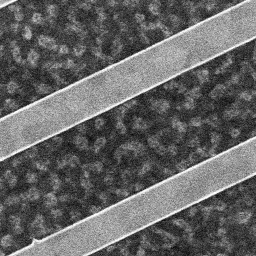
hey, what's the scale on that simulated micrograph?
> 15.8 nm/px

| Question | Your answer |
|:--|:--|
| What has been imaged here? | one or a few lines or trenches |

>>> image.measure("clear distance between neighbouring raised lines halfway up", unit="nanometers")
1440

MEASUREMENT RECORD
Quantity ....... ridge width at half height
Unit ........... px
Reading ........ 36.4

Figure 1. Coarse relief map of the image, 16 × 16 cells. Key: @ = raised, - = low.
---------------@
------------@@@@
----------@@@@@@
--------@@@@@---
------@@@@@-----
----@@@@@-------
--@@@@@---------
@@@@@-----------
@@@-------------
@-------------@@
------------@@@@
----------@@@@@-
--------@@@@@---
------@@@@@-----
----@@@@--------
--@@@@----------